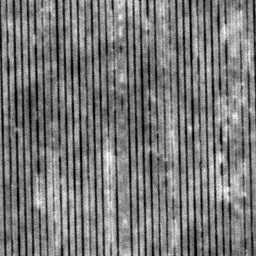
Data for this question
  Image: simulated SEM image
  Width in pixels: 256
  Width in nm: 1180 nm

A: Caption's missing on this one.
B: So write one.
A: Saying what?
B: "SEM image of parallel lines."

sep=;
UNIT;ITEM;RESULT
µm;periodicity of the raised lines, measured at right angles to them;0.0325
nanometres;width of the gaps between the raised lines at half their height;9.2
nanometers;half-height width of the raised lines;23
